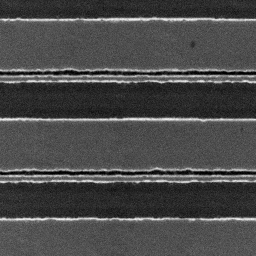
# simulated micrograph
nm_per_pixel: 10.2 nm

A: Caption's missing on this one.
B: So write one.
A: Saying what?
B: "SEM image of lines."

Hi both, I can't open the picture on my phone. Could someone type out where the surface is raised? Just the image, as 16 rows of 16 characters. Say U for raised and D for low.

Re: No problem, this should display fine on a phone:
DDDDDDDDDDDDDDDD
UUUUUUUUUUUUUUUU
UUUUUUUUUUUUUUUU
UUUUUUUUUUUUUUUU
UUUUUUUUUUUUUUUU
DDDDDDDDDDDDDDDD
DDDDDDDDDDDDDDDD
UUUUUDDUUDUDDDDD
UUUUUUUUUUUUUUUU
UUUUUUUUUUUUUUUU
UUUUUUUUUUUUUUUU
DDDDDDDDDDDDDDDD
DDDDDDDDDDDDDDDD
DDDDDDDDDDDDDDDD
UUUUUUUUUUUUUUUU
UUUUUUUUUUUUUUUU